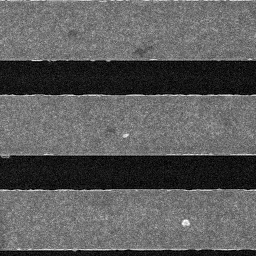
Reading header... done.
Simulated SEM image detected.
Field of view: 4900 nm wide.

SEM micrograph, lines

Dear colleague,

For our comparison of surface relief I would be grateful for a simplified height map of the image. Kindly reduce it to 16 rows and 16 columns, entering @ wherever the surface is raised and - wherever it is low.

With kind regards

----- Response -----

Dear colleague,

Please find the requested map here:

@@@@@@@@@@@@@@@@
@@@@@@@@@@@@@@@@
@@@@@@@@@@@@@@@@
@@@@@@@@@@@@@@@@
----------------
----------------
@@@@@@@@@@@@@@@@
@@@@@@@@@@@@@@@@
@@@@@@@@@@@@@@@@
@@@@@@@@@@@@@@@@
----------------
----------------
@@@@@@@@@@@@@@@@
@@@@@@@@@@@@@@@@
@@@@@@@@@@@@@@@@
@@@@@@@@@@@@@@@@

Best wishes